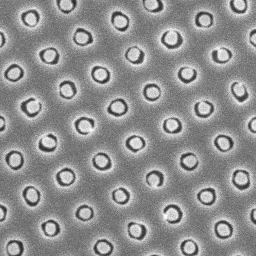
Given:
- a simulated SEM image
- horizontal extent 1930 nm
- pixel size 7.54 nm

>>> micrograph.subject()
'a regular array of ring-shaped grooves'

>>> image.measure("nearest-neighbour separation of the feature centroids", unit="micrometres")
0.282